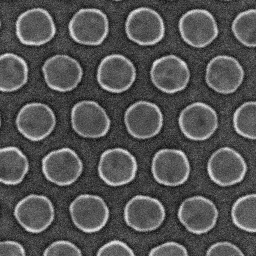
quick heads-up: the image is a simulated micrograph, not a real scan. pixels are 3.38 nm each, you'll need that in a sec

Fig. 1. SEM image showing a regular array of raised bodies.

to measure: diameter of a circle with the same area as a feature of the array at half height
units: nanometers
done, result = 124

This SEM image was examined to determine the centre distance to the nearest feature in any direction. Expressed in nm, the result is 180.